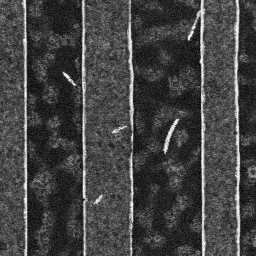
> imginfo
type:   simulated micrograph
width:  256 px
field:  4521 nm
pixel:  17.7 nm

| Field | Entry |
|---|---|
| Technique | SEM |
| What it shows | one or a few lines or trenches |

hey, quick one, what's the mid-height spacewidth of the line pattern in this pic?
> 1130 nm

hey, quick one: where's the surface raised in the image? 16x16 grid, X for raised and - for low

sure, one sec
XX---XXX-----XX-
XX---XXX-----XX-
XX---XXX-----XX-
XX---XXX-----XX-
XX---XXX-----XX-
XX---XXX-----XX-
XX---XXX-----XX-
XX---XXX-----XX-
XX---XXX-----XX-
XX---XXX-----XX-
XX---XXX-----XX-
XX---XXX-----XX-
XX---XXX-----XX-
XX---XXX-----XX-
XX---XXX-----XX-
XX---XXX-----XX-